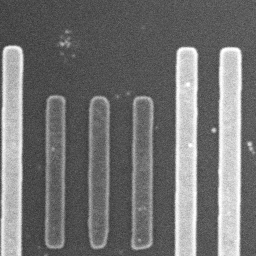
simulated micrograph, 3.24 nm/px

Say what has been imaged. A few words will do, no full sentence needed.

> wiring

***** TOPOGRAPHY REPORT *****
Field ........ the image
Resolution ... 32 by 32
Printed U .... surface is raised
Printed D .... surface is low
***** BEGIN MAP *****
DDDDDDDDDDDDDDDDDDDDDDDDDDDDDDDD
DDDDDDDDDDDDDDDDDDDDDDDDDDDDDDDD
DDDDDDDDDDDDDDDDDDDDDDDDDDDDDDDD
DDDDDDDDDDDDDDDDDDDDDDDDDDDDDDDD
DDDDDDDDDDDDDDDDDDDDDDDDDDDDDDDD
DDDDDDDDDDDDDDDDDDDDDDDDDDDDDDDD
DUUDDDDDDDDDDDDDDDDDDDUUDDDDUUDD
UUUDDDDDDDDDDDDDDDDDDDUUDDDDUUDD
UUUDDDDDDDDDDDDDDDDDDDUUDDDDUUDD
UUUDDDDDDDDDDDDDDDDDDDUUDDDDUUDD
UUUDDDDDDDDDDDDDDDDDDDUUDDDDUUDD
UUUDDDDDDDDDDDDDDDDDDDUUDDDDUUDD
UUUDDDUUDDDDUDDDDUUDDDUUDDDDUUDD
UUUDDDUUDDDUUUDDDUUDDDUUDDDDUUDD
UUUDDDUUDDDUUUDDDUUDDDUUDDDDUUDD
UUUDDDUUDDDUUUDDDUUDDDUUDDDDUUDD
UUUDDDUUDDDUUUDDDUUDDDUUDDDDUUDD
UUUDDDUUDDDUUUDDDUUDDDUUDDDDUUDD
UUUDDDUUDDDUUDDDDUUDDDUUDDDDUUDD
UUUDDDUUDDDUUDDDDUUDDDUUDDDDUUDD
UUUDDDUUDDDUUDDDDUUDDDUUDDDDUUDD
UUUDDDUUDDDUUDDDDUUDDDUUDDDDUUDD
UUUDDDUUDDDUUDDDDUUDDDUUDDDDUUDD
UUUDDDUUDDDUUDDDDUUDDDUUDDDDUUDD
UUUDDDUUDDDUUDDDDUUDDDUUDDDDUUDD
UUUDDDUUDDDUUDDDDUUDDDUUDDDDUUDD
UUUDDDUUDDDUUDDDDUUDDDUUDDDDUUDD
UUUDDDUUDDDUUDDDDUUDDDUUDDDDUUDD
UUUDDDUUDDDUUDDDDUUDDDUUDDDDUUDD
UUDDDDUUDDDUUDDDDUUDDDUUDDDDUUDD
UUDDDDUUDDDDUDDDDUUDDDUUDDDDUUDD
UUDDDDDDDDDDDDDDDDDDDDUUDDDDUUDD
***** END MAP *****